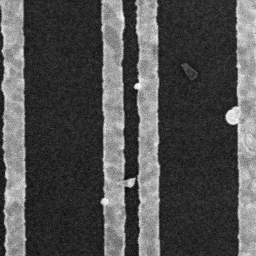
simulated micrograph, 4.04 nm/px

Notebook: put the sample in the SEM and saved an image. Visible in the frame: lines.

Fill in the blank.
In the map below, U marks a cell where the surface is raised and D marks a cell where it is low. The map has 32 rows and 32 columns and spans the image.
UUUDDDDDDDDDDUUDDUUUDDDDDDDDDDUU
UUUDDDDDDDDDDUUDDUUUDDDDDDDDDDUU
UUUDDDDDDDDDDUUDDUUUDDDDDDDDDDUU
UUUDDDDDDDDDDUUDDUUUDDDDDDDDDDUU
UUUDDDDDDDDDDUUDDUUUDDDDDDDDDDUU
DUUDDDDDDDDDDUUDDUUUDDDDDDDDDDUU
UUUDDDDDDDDDDUUDDUUUDDDDDDDDDDUU
DUUDDDDDDDDDDUUDDUUUDDDDDDDDDDUU
DUUDDDDDDDDDDUUDDUUUDDDUDDDDDDUU
DUUDDDDDDDDDDUUDDUUUDDDDDDDDDDUU
UUUDDDDDDDDDDUUDDUUUDDDDDDDDDDUU
UUUDDDDDDDDDDUUDDUUUDDDDDDDDDDUU
DUUDDDDDDDDDDUUDDUUUDDDDDDDDDDUU
DUUDDDDDDDDDDUUDDUUUDDDDDDDDDUUU
UUUDDDDDDDDDDUUDDUUUDDDDDDDDUUUU
DUUDDDDDDDDDDUUDDUUUDDDDDDDDDUUU
UUUDDDDDDDDDDUUDDUUUDDDDDDDDDDUU
UUUDDDDDDDDDDUUDDUUUDDDDDDDDDDUU
DUUDDDDDDDDDDUUDDUUUDDDDDDDDDDUU
DUUDDDDDDDDDDUUDDUUUDDDDDDDDDDUU
DUUDDDDDDDDDDUUDDUUUDDDDDDDDDDUU
DUUDDDDDDDDDDUUDDUUUDDDDDDDDDDUU
DUUDDDDDDDDDDUUUDUUUDDDDDDDDDDUU
DUUDDDDDDDDDDUUUDUUUDDDDDDDDDDUU
DUUDDDDDDDDDDUUDDUUUDDDDDDDDDDUU
DUUDDDDDDDDDDUUUDDUUDDDDDDDDDDUU
DUUDDDDDDDDDDUUUDUUUDDDDDDDDDDUU
DUUDDDDDDDDDDUUUDUUUDDDDDDDDDDUU
DUUDDDDDDDDDDUUDDUUUDDDDDDDDDDUU
DUUDDDDDDDDDDUUUDUUUDDDDDDDDDDUU
DUUDDDDDDDDDDUUUDUUUDDDDDDDDDDUU
DUUDDDDDDDDDDUUDDUUUDDDDDDDDDDUU